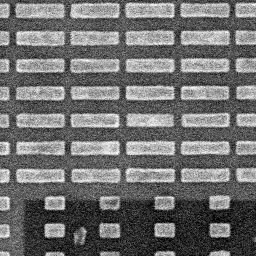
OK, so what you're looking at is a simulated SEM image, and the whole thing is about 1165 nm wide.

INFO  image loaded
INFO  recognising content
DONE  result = wiring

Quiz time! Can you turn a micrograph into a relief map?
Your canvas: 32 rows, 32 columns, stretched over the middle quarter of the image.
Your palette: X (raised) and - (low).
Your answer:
--XXXXXXXXXXX---XXXXXXXXXXX---XX
--XXXXXXXXXXX---XXXXXXXXXXX---XX
--------------------------------
--------------------------------
--------------------------------
--------------------------------
--XXXXXXXXXXXX--XXXXXXXXXXX--XXX
--XXXXXXXXXXXX--XXXXXXXXXXX--XXX
--XXXXXXXXXXX---XXXXXXXXXXX--XXX
--------------------------------
--------------------------------
--------------------------------
--------------------------------
--XXXXXXXXXXX---XXXXXXXXXXX---XX
--XXXXXXXXXXX---XXXXXXXXXXX---XX
--XXXXX--XXXX-------------------
--------------------------------
--------------------------------
--------------------------------
--------------------------------
--XXXXXXXXXXXX--XXXXXXXXXXX---XX
--XXXXXXXXXXXX--XXXXXXXXXXX---XX
--XX----------------------------
--------------------------------
--------------------------------
--------------------------------
----X-----------XXX-----------XX
--XXXXXXXXXXX---XXXXXXXXXXX---XX
--XXXXXXXXXXX---XXXXXXXXXXX---XX
--------------------------------
--------------------------------
--------------------------------